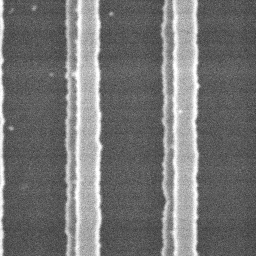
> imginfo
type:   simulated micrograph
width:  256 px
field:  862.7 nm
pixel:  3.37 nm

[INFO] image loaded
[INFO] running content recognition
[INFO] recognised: lines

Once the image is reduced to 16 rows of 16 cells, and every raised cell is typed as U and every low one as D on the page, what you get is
DDDDUUDDDDUUDDDD
DDDDUUDDDDUUDDDD
DDDDUUDDDDUUDDDD
DDDDUUDDDDUUDDDD
DDDDUUDDDDUUDDDD
DDDDUUDDDDUUDDDD
DDDDUUDDDDUUDDDD
DDDDUUDDDDUUDDDD
DDDDUUDDDDUUDDDD
DDDDUUDDDDUUDDDD
DDDDUUDDDDUUDDDD
DDDDUUDDDDUUDDDD
DDDDUUDDDDUUDDDD
DDDDUUDDDDUUDDDD
DDDDUUDDDDUUDDDD
DDDDUUDDDDUUDDDD